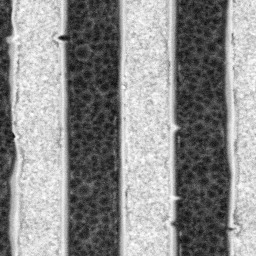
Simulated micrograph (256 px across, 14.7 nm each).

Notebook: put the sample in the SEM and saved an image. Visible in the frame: one or a few lines or trenches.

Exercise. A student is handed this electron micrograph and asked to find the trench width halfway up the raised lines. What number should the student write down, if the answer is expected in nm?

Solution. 844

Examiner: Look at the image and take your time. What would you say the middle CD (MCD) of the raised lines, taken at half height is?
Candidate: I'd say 743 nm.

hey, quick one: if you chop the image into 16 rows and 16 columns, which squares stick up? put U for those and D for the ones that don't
DUUUDDDDUUUDDDUU
DUUUDDDDUUUDDDUU
DUUUDDDDUUUDDDUU
DUUUDDDDUUUDDDUU
DUUUDDDDUUUDDDUU
DUUUDDDDUUUDDDUU
DUUUDDDDUUUDDDUU
DUUUDDDDUUUDDDUU
DUUUDDDDUUUDDDUU
DUUUDDDDUUUDDDUU
DUUUDDDDUUUDDDDU
DUUUDDDDUUUDDDUU
DUUUDDDDUUUDDDUU
DUUUDDDDUUUDDDUU
DUUUDDDDUUUDDDUU
DUUUDDDDUUUDDDUU